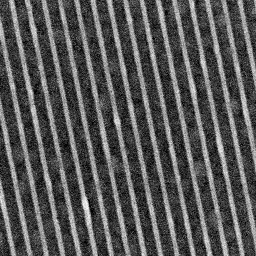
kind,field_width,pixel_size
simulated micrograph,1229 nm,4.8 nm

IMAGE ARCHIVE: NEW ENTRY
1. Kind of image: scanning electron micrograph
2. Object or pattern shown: parallel lines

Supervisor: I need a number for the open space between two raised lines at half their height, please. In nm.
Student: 60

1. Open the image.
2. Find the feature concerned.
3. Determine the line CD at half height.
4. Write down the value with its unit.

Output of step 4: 15.9 nm